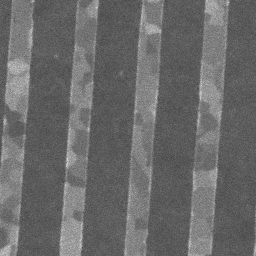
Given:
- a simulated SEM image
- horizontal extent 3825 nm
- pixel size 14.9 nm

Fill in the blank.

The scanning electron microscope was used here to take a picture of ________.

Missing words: one or a few lines or trenches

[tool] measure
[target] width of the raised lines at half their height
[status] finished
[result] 317 nanometers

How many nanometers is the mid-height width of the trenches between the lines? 648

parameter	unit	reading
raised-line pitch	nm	964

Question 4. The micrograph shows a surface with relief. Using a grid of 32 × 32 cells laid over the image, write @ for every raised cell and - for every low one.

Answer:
--@@------@@------@@------@@@---
-@@@------@@------@@------@@----
-@@@------@@------@@------@@----
-@@@-----@@@------@@------@@----
-@@@-----@@@-----@@@------@@----
-@@@-----@@@-----@@@-----@@@----
-@@@-----@@@-----@@@-----@@@----
-@@@-----@@@-----@@@-----@@@----
-@@@-----@@@-----@@@-----@@@----
-@@@-----@@@-----@@@-----@@@----
-@@@-----@@@-----@@@-----@@@----
-@@@-----@@@-----@@@-----@@@----
-@@------@@------@@@-----@@@----
-@@------@@------@@------@@@----
-@@------@@------@@------@@@----
-@@------@@------@@------@@-----
@@@------@@------@@------@@-----
@@@------@@------@@------@@-----
@@@-----@@@------@@-----@@@-----
@@@-----@@@-----@@@-----@@@-----
@@@-----@@@-----@@@-----@@@-----
@@@-----@@@-----@@@-----@@@-----
@@@-----@@@-----@@@-----@@@-----
@@@-----@@@-----@@@-----@@@-----
@@@-----@@@-----@@@-----@@@-----
@@@-----@@------@@@-----@@@-----
@@------@@------@@@-----@@@-----
@@------@@------@@------@@@-----
@@------@@------@@------@@@-----
@@------@@------@@------@@@-----
@@------@@------@@------@@------
@@------@@------@@------@@------